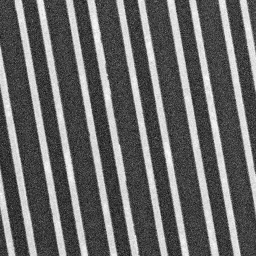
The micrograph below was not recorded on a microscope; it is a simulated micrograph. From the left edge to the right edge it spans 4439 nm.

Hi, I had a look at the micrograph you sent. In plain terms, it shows parallel lines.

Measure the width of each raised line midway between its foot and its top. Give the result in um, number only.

0.107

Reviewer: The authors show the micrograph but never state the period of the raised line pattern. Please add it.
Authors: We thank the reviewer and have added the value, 25.1 pixels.